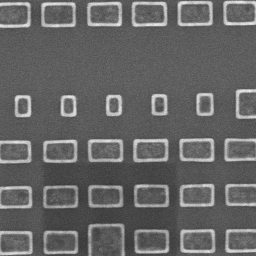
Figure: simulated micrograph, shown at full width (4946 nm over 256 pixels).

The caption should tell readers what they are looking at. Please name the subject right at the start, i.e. wiring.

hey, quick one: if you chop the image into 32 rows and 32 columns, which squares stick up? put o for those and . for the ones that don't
ooo...ooo...ooo..ooo...ooo..oooo
oooo.oooo..oooo..oooo.oooo..oooo
oooo.oooo..oooo..oooo.oooo..oooo
................................
................................
................................
................................
................................
................................
................................
................................
..............................oo
..oo....o.....o....oo....o....oo
..oo....o.....o....oo....o....oo
..............................oo
................................
................................
................................
oooo..ooo..oooo..oooo..oooo.oooo
oooo..ooo..oooo..oooo..oooo.oooo
................................
................................
................................
..o...ooo..oooo..oooo..ooo..oooo
oooo..ooo..oooo..oooo..oooo.oooo
oooo..ooo..oooo..oooo..ooo...ooo
................................
................................
...........oooo.................
oooo..ooo..oooo..oooo..oooo.oooo
oooo..ooo..oooo..oooo..oooo.oooo
ooo...ooo..oooo.................